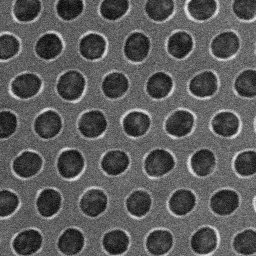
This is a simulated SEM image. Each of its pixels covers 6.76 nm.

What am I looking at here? a regular array of holes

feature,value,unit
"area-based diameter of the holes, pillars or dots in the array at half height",191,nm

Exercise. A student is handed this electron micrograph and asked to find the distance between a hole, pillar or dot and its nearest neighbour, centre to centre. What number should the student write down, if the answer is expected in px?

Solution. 43.5